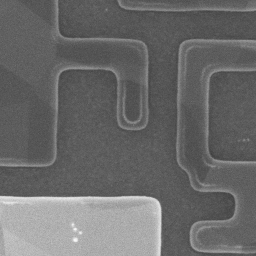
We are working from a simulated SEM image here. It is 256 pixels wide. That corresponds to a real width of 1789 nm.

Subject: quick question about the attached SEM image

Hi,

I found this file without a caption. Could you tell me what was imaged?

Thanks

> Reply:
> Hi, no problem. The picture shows wiring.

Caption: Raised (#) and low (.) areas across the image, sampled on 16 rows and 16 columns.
####....########
####............
########....##..
#########..#####
####...##..###..
####...##..##...
####...##..##...
####...##..##...
####.......##...
####.......##...
...........#####
............####
##########.....#
##########....##
##########..####
##########..####